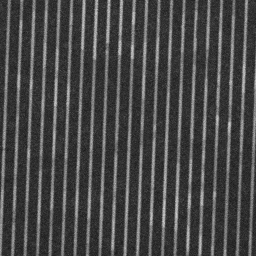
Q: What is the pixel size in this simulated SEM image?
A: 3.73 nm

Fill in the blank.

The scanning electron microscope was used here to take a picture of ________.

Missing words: parallel lines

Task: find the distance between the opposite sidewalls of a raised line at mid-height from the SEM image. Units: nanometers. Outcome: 7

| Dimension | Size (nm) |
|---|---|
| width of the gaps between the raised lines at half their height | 38.2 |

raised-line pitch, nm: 46.6